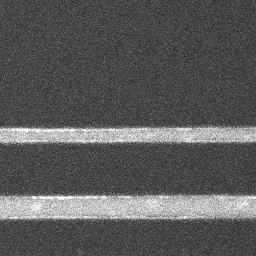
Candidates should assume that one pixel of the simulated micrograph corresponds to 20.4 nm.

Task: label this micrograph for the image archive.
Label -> one or a few lines or trenches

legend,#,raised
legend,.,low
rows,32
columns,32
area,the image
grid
################################
################################
################################
################################
################################
################################
################################
################################
################################
################################
################################
################################
################################
################################
################################
################################
................................
................................
################################
################################
################################
################################
################################
################################
################################
....#...........................
................................
################################
################################
################################
################################
################################